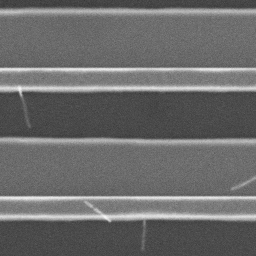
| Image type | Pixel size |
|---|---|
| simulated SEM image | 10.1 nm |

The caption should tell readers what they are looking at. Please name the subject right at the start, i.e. lines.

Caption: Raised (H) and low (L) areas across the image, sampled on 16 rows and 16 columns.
LLLLLLLLLLLLLLLL
HHHHHHHHHHHHHHHH
HHHHHHHHHHHHHHHH
HHHHHHHHHHHHHHHH
HHHHHHHHHHHHHHHH
HHHHHHHHHHHHHHHH
LLLLLLLLLLLLLLLL
LLLLLLLLLLLLLLLL
LLLLLLLLLLLLLLLL
HHHHHHHHHHHHHHHH
HHHHHHHHHHHHHHHH
HHHHHHHHHHHHHHHH
HHHHHHHHHHHHHHHH
HHHHHHHHHHHHHHHH
LLLLLLLLLLLLLLLL
LLLLLLLLLLLLLLLL